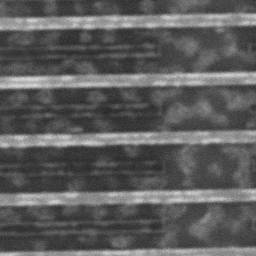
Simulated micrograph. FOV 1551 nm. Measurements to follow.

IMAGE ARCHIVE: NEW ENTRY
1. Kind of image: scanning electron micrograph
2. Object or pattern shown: parallel lines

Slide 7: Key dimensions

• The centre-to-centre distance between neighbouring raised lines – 29.2 px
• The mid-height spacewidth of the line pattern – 111 nanometers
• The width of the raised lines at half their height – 64.4 nanometers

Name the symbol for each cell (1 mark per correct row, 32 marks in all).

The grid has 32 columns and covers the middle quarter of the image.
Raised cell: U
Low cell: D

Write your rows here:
DDDDDDDDDDDDDDDDDDDDDDDDDDDDDDDD
DDDDDDDDDDDDDDDDDDDDDDDDDDDDDDDD
DDDDDDDDDDDDDDDDDDDDDDDDDDDDDDDD
UUUUUUUUUUUUUUUUUUUUUUUUUUUUUUUU
UUUUUUUUUUUUUUUUUUUUUUUUUUUUUUUU
UUUUUUDDDDDDDDDDDDDDDDDDDDDDDDDD
DDDDDDDDDDDDDDDDDDDDDDDDDDDDDDDD
DDDDDDDDDDDDDDDDDDDDDDDDDDDDDDDD
DDDDDDDDDDDDDDDDDDDDDDDDDDDDDDDD
DDDDDDDDDDDDDDDDDDDDDDDDDDDDDDDD
DDDDDDDDUUUUUUUUUUUUUUUUDDDDDDDD
UUUUUUUUUUUUUUUUUUUUUUUUDDDDDDDD
UUUUUUUUUUUUUUUUUUUUUUUUDDDDDDDD
DDDDDDDDDDDDDDDDDDDDDDDDDDDDDDDD
DDDDDDDDDDDDDDDDDDDDDDDDDDDDDDDD
DDDDDDDDDDDDDDDDDDDDDDDDDDDDDDDD
DDDDDDDDDDDDDDDDDDDDDDDDDDDDDDDD
DDDDDDDDDDDDDDDDDUUUUUUUUUUUUUUU
UUUUUUUUUUUUUUUUUUUUUUUUUUUUUUUU
UUUUUUUUUUUUUUUUUUUUUUUUUUUUUUUU
DDDDDDDDDDDDDDDDDDDDDDDDDDDDDDDD
DDDDDDDDDDDDDDDDDDDDDDDDDDDDDDDD
DDDDDDDDDDDDDDDDDDDDDDDDDDDDDDDD
DDDDDDDDDDDDDDDDDDDDDDDDDDDDDDDD
DDDDDDDDDDDDDDDDDDDDDDDDDDDDDDDD
UUUUUUUUUUUUUUUUUUUUUUUUUDDDDDDD
UUUUUUUUUUUUUUUUUUUUUUUUUDDDDDDD
UUDDDUUDUDDDDDDDDDDDDDDDDDDDDDDD
DDDDDDDDDDDDDDDDDDDDDDDDDDDDDDDD
DDDDDDDDDDDDDDDDDDDDDDDDDDDDDDDD
DDDDDDDDDDDDDDDDDDDDDDDDDDDDDDDD
DDDDDDDDDDDDDDDDDDDDDDDDDDDDDDDD